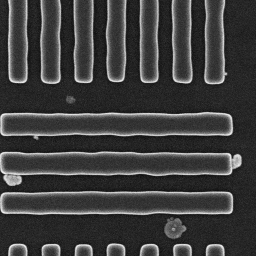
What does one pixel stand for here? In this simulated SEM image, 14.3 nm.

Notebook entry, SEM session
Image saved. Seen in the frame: groups of lines, slits or small figures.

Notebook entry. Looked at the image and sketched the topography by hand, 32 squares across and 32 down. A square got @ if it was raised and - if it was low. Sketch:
-@@--@@--@@@--@@--@@--@@--@@----
-@@--@@--@@@--@@--@@--@@--@@----
-@@--@@--@@@--@@--@@--@@--@@----
-@@--@@--@@@-@@@--@@--@@--@@----
-@@--@@--@@@-@@@--@@--@@--@@----
-@@--@@--@@@-@@@--@@--@@--@@----
-@@--@@--@@@--@@--@@--@@--@@----
-@@--@@--@@@-@@@--@@--@@--@@----
-@@--@@--@@@-@@@--@@--@@--@@----
-@@--@@--@@---@@--@@--@@--@@----
--------------------------------
--------------------------------
--------------------------------
--------------------------------
@@@@@@@@@@@@@@@@@@@@@@@@@@@@@---
@@@@@@@@@@@@@@@@@@@@@@@@@@@@@---
@@@@@@@@@@@@@@@@@@@@@@@@@@@@@---
--------------------------------
--------------------------------
@@@@@@@@@@@@@@@@@@@@@@@@@@@@@---
@@@@@@@@@@@@@@@@@@@@@@@@@@@@@@--
@@@@@@@@@@@@@@@@@@@@@@@@@@@@@---
-@------------------------------
--------------------------------
@@@@@@@@@@@@@@@@@@@@@@@@@@@@@---
@@@@@@@@@@@@@@@@@@@@@@@@@@@@@---
@@@@@@@@@@@@@@@@@@@@@@@@@@@@@---
--------------------------------
--------------------------------
--------------------------------
--------------------------------
-@@--@@--@@--@@@--@@--@@--@@----